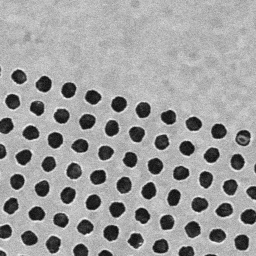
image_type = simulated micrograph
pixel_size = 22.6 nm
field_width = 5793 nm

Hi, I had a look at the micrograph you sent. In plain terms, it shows a regular array of holes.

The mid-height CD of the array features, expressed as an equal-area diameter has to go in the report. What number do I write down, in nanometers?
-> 365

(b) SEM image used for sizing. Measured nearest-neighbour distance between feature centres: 569 nm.